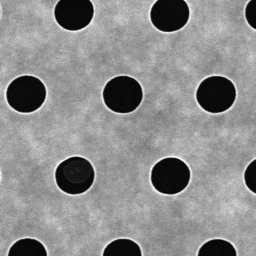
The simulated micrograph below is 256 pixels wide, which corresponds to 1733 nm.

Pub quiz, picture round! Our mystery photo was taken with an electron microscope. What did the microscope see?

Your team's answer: holes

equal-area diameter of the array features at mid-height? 260 nanometers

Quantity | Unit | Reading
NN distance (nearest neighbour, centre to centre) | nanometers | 632